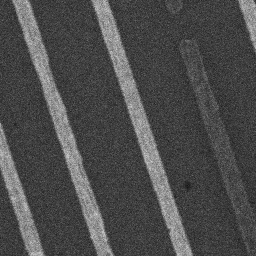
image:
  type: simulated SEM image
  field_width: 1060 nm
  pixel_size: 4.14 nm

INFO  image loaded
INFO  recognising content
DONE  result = one or a few lines or trenches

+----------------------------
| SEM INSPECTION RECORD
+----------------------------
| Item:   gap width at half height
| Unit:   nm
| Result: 230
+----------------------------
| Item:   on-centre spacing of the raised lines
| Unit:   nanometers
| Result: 297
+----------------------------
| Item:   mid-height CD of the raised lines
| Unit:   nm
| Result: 59.4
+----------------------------